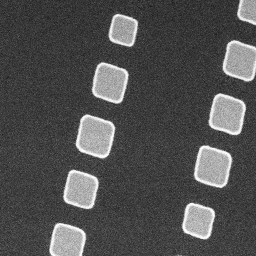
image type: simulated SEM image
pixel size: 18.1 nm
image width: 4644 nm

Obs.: raised bodies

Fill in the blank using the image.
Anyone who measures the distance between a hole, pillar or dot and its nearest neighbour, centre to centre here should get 0.986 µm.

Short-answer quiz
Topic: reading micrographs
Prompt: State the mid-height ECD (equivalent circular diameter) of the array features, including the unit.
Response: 653 nanometres